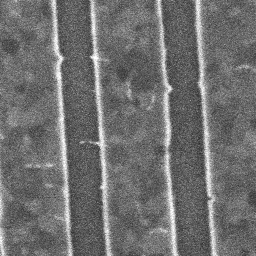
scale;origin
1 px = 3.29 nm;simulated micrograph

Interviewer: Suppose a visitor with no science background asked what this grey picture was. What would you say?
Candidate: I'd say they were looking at one or a few lines or trenches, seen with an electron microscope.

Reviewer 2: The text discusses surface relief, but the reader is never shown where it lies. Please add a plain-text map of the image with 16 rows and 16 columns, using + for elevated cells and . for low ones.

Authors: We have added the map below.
+++...++++..++++
++++..++++..++++
++++..++++..++++
++++..++++..++++
++++..++++...+++
++++..+++++..+++
++++..++++...+++
++++..++++...+++
++++..+++++..+++
++++..++++...+++
++++..+++++..+++
++++..+++++..+++
++++...++++..+++
++++...++++..+++
++++...++++..+++
++++...++++..+++